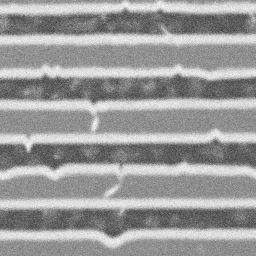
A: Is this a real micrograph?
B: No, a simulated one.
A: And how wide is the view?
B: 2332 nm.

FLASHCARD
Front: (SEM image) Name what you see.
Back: one or a few lines or trenches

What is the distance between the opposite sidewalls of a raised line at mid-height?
307 nanometers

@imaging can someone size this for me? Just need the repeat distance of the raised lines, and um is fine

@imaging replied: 0.596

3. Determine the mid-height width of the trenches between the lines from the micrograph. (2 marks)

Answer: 289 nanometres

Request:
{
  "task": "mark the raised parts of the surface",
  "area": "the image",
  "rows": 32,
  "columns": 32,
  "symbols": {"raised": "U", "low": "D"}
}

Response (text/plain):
UUUUUUUUUUUUUUUUUUUUUUUUUUUUUUUU
DDDDDDDDDDDDDDDDDDDDDDDDDDDDDDDD
DDDDDDDDDDDDDDDDDDDDDDDDDDDDDDDD
DDDDDDDDDDDDDDDDDDDDDDDDDDDDDDDD
DDDDDDDDDDDDDDDDDDDDDDDDDDDDDDDD
UUUUUUUUUUUUUUUUUUUUUUUUUUUUUUUU
UUUUUUUUUUUUUUUUUUUUUUUUUUUUUUUU
UUUUUUUUUUUUUUUUUUUUUUUUUUUUUUUU
UUUUUUUUUUUUUUUUUUUUUUUUUUUUUUUU
DDDDDDDDDDDDDDDDDDDDDDDDDDDDDDDD
DDDDDDDDDDDDDDDDDDDDDDDDDDDDDDDD
DDDDDDDDDDDDDDDDDDDDDDDDDDDDDDDD
DDDDDDDDDDDDDDDDDDDDDDDDDDDDDDDD
UUUUUUUUUUUDUUUUUUUUUUUUUUUUUUUU
UUUUUUUUUUUUUUUUUUUUUUUUUUUUUUUU
UUUUUUUUUUUUUUUUUUUUUUUUUUUUUUUU
UUUUUUUUUUUUUUUUUUUUUUUUUUUUUUUU
DDDUDDDDDDDDDDDDDDDDDDDDDDDDDDDD
DDDDDDDDDDDDDDDDDDDDDDDDDDDDDDDD
DDDDDDDDDDDDDDDDDDDDDDDDDDDDDDDD
DDDDDDDDDDDDDDDDDDDDDDDDDDDDDDDD
DDDUUUDDUUUUUUUUUUUUUUUUUUUUUUUD
UUUUUUUUUUUUUUUUUUUUUUUUUUUUUUUU
UUUUUUUUUUUUUUUUUUUUUUUUUUUUUUUU
UUUUUUUUUUUUUUUUUUUUUUUUUUUUUUUU
UUUUUDDDDDDDDDDUDDDDDDDDDDDDDDDD
DDDDDDDDDDDDDDDDDDDDDDDDDDDDDDDD
DDDDDDDDDDDDDDDDDDDDDDDDDDDDDDDD
DDDDDDDDDDDDDDDDDDDDDDDDDDDDDDDD
UUUUUUUUUUUUDDDDUUUUUUUUUUUUUUUU
UUUUUUUUUUUUUUUUUUUUUUUUUUUUUUUU
UUUUUUUUUUUUUUUUUUUUUUUUUUUUUUUU